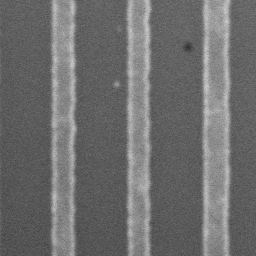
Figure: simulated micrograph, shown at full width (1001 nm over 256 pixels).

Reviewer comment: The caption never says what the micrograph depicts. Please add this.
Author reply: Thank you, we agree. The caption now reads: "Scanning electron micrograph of lines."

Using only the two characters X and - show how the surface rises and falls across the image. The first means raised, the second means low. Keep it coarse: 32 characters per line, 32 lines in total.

-------XX-------XXX-------XXX---
-------XX-------XXX-------XX----
-------XX-------XX--------XX----
-------XX-------XX--------XXX---
-------XX-------XXX-------XX----
-------XX-------XXX-------XX----
-------XX-------XXX-------XX----
-------XX-------XX--------XX----
-------XX-------XXX-------XX----
-------XX-------XX--------XX----
-------XX-------XX--------XXX---
-------XX-------XX--------XX----
-------XX-------XX--------XX----
-------XX-------XX--------XX----
-------XX-------XX--------XXX---
-------XX-------XXX-------XXX---
-------XX-------XX--------XX----
-------XX-------XX--------XX----
-------XX-------XXX-------XXX---
-------XX-------XXX-------XX----
-------XX-------XX--------XX----
-------XX-------XX--------XXX---
-------XX-------XXX-------XXX---
-------XX-------XX--------XX----
-------XX-------XX--------XX----
-------XX-------XXX-------XX----
-------XX-------XXX-------XX----
-------XX-------XXX-------XX----
-------XX-------XXX-------XX----
-------XX-------XX--------XX----
-------XX-------XXX-------XX----
-------XX-------XXX-------XX----